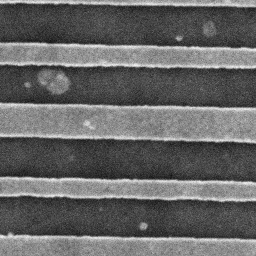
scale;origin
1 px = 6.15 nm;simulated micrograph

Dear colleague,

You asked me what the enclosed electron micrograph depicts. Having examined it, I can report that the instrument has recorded lines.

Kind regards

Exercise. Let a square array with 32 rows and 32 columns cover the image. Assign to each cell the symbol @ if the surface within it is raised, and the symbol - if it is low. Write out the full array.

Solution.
--------------@@@@@@@@@@@@@@@@@@
--------------------------------
--------------------------------
--------------------------------
--------------------------------
@@@@@@--------------------------
@@@@@@@@@@@@@@@@@@@@@@@@@@@@@@@@
@@@@@@@@@@@@@@@@@@@@@@@@@@@@@@@@
--------------------------------
-----@-@------------------------
-------@------------------------
--------------------------------
--------------------------------
@@@@@@@@@@@@@@@@@@@@@@@@@@@@----
@@@@@@@@@@@@@@@@@@@@@@@@@@@@@@@@
@@@@@@@@@@@@@@@@@@@@@@@@@@@@@@@@
@@@@@@@@@@@@@@@@@@@@@@@@@@@@@@@@
------------------------@@@@@@@@
--------------------------------
--------------------------------
--------------------------------
--------------------------------
@@@@@@@@@@@@@-@@----------------
@@@@@@@@@@@@@@@@@@@@@@@@@@@@@@@@
-----@@-@@@@@@@@@@@@@@@@@@@@@@@@
--------------------------------
--------------------------------
--------------------------------
--------------------------------
---@----------------------------
@@@@@@@@@@@@@@@@@@@@@@@@@@@@@@@@
@@@@@@@@@@@@@@@@@@@@@@@@@@@@@@@@